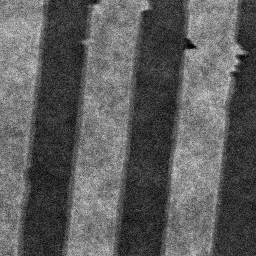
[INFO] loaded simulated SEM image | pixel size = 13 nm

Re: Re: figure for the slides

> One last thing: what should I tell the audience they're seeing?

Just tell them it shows one or a few lines or trenches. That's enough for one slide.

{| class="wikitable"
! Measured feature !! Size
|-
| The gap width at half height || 621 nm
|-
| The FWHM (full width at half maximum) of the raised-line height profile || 632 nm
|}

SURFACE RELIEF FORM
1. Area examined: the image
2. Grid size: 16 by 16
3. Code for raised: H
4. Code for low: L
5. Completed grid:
HHHLLLHHHLLLHHHL
HHHLLLHHHLLLHHHL
HHHLLHHHHLLLHHHL
HHLLLHHHLLLLHHHL
HHLLLHHHLLLHHHHL
HHLLLHHHLLLHHHLL
HHLLLHHHLLLHHHLL
HHLLLHHHLLLHHHLL
HHLLLHHHLLLHHHLL
HHLLLHHHLLLHHHLL
HHLLLHHHLLLHHHLL
HHLLLHHHLLLHHHLL
HLLLHHHLLLLHHHLL
HLLLHHHLLLLHHHLL
HLLLHHHLLLHHHLLL
HLLLHHHLLLHHHLLL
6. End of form